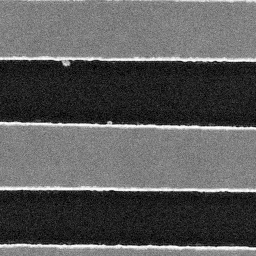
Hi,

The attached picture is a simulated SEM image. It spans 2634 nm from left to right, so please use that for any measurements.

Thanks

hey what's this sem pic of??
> lines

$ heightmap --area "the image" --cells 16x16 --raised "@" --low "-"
@@@@@@@@@@@@@@@@
@@@@@@@@@@@@@@@@
@@@@@@@@@@@@@@@@
@@@@@@@@@@@@@@@@
----------------
----------------
----------------
----------------
@@@@@@@@@@@@@@@@
@@@@@@@@@@@@@@@@
@@@@@@@@@@@@@@@@
@@@@@@@@@@@@@@@@
----------------
----------------
----------------
@@@@@@@@@@@@@@@@